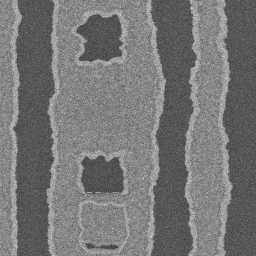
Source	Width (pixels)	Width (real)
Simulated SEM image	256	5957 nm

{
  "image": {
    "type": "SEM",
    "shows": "one or a few lines or trenches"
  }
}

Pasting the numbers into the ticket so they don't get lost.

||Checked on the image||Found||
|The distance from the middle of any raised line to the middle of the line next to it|1650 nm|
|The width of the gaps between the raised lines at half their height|896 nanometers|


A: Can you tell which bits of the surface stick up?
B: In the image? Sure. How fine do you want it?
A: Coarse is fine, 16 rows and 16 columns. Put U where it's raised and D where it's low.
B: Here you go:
UDDDUUUUUDDDUUDD
UDDUUDDDUDDDUUDD
UDDUUDDDUUDDUUDD
UDDUUDDDUUDDUUDD
UDDUUUUUUUDDUUDD
UDDDUUUUUUDDUUDD
UDDUUUUUUUDDUUDD
UDDUUUUUUUDDUUDD
UDDUUUUUUUDDUUDD
UDDUUUUUUUDDUUDD
UDDUUDDDUUDDUUDD
UDDUUDDDUUDDUUDD
UDDUUUUUUUDDUUDD
UDDUUUUUUUDDUUDD
UDDUUUUUUDDDUUDD
UDDUUUUUUDDDUUDD